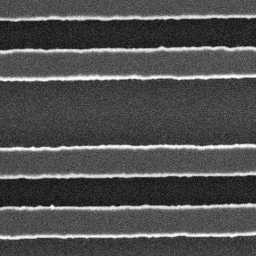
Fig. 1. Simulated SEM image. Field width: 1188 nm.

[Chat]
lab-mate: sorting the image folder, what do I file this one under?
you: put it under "lines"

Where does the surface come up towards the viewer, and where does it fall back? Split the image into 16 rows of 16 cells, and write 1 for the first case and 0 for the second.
1111111111111111
0000000000000000
0000000000000000
1111111111111111
1111111111111111
0000000000000000
0000000000000000
0000000000000000
0000000000000000
1111111111111111
1111111111111111
0000000000000000
0000000000000000
1111111111111111
1111111111111111
0000000000000000